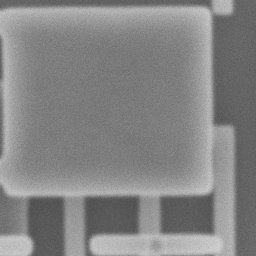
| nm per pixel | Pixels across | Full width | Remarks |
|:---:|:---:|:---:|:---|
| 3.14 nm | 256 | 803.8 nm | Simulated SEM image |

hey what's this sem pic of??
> wiring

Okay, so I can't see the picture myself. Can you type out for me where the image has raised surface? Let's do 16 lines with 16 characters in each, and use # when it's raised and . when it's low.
........#####...
#############...
#############...
#############...
#############...
#############...
#############...
#############...
#############...
#############...
#############...
#############...
................
................
................
##....########..